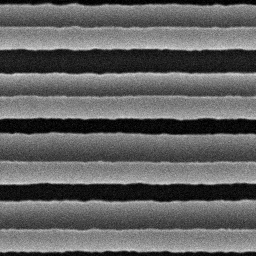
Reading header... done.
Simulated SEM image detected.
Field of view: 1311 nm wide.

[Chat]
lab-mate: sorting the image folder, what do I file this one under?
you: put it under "lines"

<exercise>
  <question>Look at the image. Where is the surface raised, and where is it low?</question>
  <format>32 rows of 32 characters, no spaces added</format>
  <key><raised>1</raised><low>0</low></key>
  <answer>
00000000000000000000000000000000
11111111111111111111111111111111
11111111111111111111111111111111
11111111111111111111111111111111
11111111111111111111111111111111
11111111111111111111111111111111
00000000000000000000000000000000
00000000000000000000000000000000
00000000000000000000000000000000
11111111111111111111111111111111
11111111111111111111111111111111
11111111111111111111111111111111
11111111111111111111111111111111
11111111111111111111111111111111
11111111111111111111111111111111
00000000000000000000000000000000
00000000000000000000000000000000
11111111111111111111111111111111
11111111111111111111111111111111
11111111111111111111111111111111
11111111111111111111111111111111
11111111111111111111111111111111
11111111111111111111111111111111
00000000000000000000000000000000
00000000000000000000000000000000
11111111111111111111111111111111
11111111111111111111111111111111
11111111111111111111111111111111
11111111111111111111111111111111
11111111111111111111111111111111
11111111111111111111111111111111
00000000000000000000000000000000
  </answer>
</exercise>